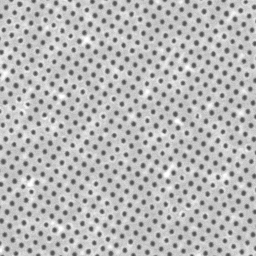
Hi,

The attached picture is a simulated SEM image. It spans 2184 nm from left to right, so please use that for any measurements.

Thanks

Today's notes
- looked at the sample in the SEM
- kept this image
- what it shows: a regular array of holes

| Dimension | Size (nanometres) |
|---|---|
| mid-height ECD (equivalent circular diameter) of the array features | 47.2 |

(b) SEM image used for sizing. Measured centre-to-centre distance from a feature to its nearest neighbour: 83.5 nm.